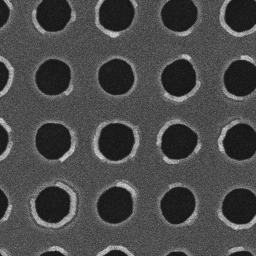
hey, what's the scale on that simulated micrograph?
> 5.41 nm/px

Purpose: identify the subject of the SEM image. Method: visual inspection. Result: a regular array of holes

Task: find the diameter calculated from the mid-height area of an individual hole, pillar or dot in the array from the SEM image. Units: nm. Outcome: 194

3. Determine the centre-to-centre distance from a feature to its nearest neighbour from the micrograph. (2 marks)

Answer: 340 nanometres